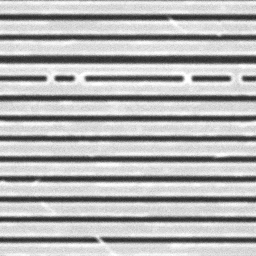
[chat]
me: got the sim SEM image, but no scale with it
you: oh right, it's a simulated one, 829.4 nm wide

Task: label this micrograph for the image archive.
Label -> parallel lines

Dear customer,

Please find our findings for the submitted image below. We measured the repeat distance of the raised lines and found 65.7 nanometers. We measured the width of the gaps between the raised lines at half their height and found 22.3 nm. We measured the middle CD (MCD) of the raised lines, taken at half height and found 44.2 nanometers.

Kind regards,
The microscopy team